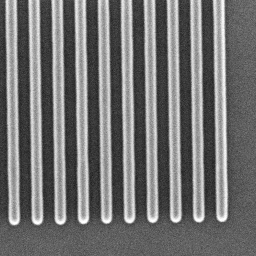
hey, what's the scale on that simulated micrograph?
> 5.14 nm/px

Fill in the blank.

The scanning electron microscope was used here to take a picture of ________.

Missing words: groups of lines, slits or small figures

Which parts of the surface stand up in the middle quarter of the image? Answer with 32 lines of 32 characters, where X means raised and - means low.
---XXX---XX----XX----XX---XX----
---XXX---XX----XX----XX---XX----
---XXX---XX----XX----XX---XX----
---XXX---XX----XX----XX---XX----
---XXX---XX----XX----XX---XX----
---XXX---XX----XX----XX---XX----
---XXX---XX----XX----XX---XXX---
---XXX---XX----XX----XX---XXX---
---XXX---XX----XX----XX---XXX---
---XXX---XX----XX----XX---XXX---
---XXX---XX----XX----XX---XXX---
---XXX---XX----XX----XX---XXX---
---XXX---XX----XX----XX---XXX---
---XXX---XX----XX----XX---XXX---
---XXX---XX----XX----XX---XXX---
---XXX---XX----XX----XX----XX---
---XXX---XX----XX----XX----XX---
---XXX---XX----XX----XX----XX---
---XXX---XX----XX----XX----XX---
---XXX---XX----XX----XX----XX---
---XXX---XX----XX----XX----XX---
----XX---XXX---XX----XX----XX---
----XX---XXX---XX----XX----XX---
----XX---XXX---XX----XX----XX---
----XX---XXX---XX----XX----XX---
----XX---XXX---XX----XX----XX---
----XX---XXX---XX----XX----XX---
----XX----XX---XX----XX----XX---
----XX----XX---XX----XX----XX---
----XX----XX---XX----XX----XX---
----XX----XX---XX----XX----XX---
----XX----XX---XX----XX----XX---